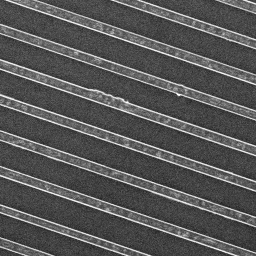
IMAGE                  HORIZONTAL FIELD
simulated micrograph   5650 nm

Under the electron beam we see parallel lines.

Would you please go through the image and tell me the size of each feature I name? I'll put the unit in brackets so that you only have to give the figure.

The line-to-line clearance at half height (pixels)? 24.7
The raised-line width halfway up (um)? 0.206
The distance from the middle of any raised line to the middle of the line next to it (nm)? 747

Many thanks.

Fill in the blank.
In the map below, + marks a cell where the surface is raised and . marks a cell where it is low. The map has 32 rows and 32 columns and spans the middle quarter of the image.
........+++++++.................
...........+++++++..............
..............+++++++...........
.................+++++++........
+...................+++++++.....
++++...................+++++++..
+++++++...................++++++
..++++++++...................+++
.....++++++++...................
........+++++++.................
...........+++++++..............
..............+++++++...........
.................+++++++........
+...................+++++++.....
++++...................+++++++..
+++++++...................++++++
...+++++++...................+++
......+++++++...................
.........+++++++................
............+++++++.............
...............+++++++..........
..................+++++++.......
+....................+++++++....
++++...................++++++++.
+++++++...................++++++
...+++++++...................+++
......+++++++...................
.........+++++++................
............+++++++.............
...............+++++++..........
..................+++++++.......
+...................++++++++....